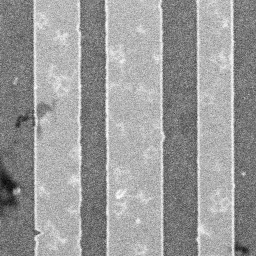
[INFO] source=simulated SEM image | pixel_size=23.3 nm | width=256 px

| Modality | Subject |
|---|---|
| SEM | one or a few lines or trenches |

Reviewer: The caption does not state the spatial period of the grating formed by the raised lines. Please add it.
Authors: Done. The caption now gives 1840 nm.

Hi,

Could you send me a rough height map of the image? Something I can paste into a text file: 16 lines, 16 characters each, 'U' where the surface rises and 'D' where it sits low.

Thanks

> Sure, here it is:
DDUUUDDUUUDDUUDD
DDUUUDDUUUDDUUDD
DDUUUDDUUUDDUUUD
DDUUUDDUUUDDUUDD
DDUUUDDUUUDDUUDD
DDUUUDDUUUDDUUUD
DDUUUDDUUUDDUUUD
DDUUUDDUUUDDUUUD
DDUUUDDUUUDDUUUD
DDUUUDDUUUDDUUUD
DDUUUDDUUUDDUUUD
DDUUUDDUUUDDUUUD
DDUUUDDUUUDDUUUD
DDUUUDDUUUDDUUUD
DDUUUDDUUUDDUUUD
DDUUUDDUUUDDUUUD